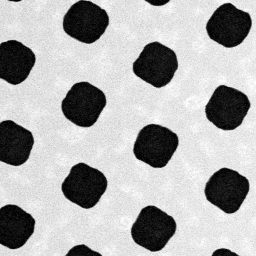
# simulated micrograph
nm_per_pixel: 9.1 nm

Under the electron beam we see a regular array of holes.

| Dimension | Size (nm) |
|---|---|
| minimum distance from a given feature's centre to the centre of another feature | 738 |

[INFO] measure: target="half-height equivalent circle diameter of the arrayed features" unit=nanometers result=392